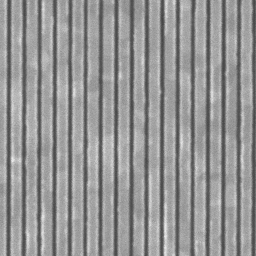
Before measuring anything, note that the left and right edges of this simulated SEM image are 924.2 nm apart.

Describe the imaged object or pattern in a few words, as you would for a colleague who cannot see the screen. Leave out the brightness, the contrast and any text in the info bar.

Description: parallel lines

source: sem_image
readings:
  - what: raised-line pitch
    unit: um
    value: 0.0554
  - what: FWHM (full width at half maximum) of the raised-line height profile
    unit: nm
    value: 36.5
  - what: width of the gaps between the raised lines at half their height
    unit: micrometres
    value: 0.0167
